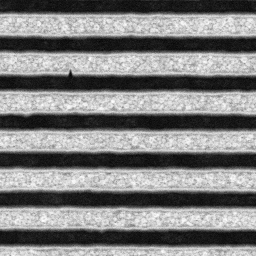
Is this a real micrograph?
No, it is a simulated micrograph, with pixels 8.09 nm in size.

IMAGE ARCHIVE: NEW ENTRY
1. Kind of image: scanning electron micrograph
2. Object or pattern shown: parallel lines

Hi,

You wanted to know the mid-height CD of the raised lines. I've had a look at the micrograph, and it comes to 186 nm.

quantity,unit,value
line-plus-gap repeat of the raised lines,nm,313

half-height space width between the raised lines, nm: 126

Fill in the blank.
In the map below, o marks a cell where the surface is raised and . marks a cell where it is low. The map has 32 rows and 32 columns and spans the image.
................................
................................
oooooooooooooooooooooooooooooooo
oooooooooooooooooooooooooooooooo
.ooooooooooooooo.o.ooooooooooooo
................................
o...............................
oooooooooooooooooooooooooooooooo
oooooooooooooooooooooooooooooooo
................................
................................
oooooooooo.ooooo.oooooooo..ooooo
oooooooooooooooooooooooooooooooo
oooooooooooooooooooooooooooooooo
................................
................................
oooooooooooooooooooooooooooooooo
oooooooooooooooooooooooooooooooo
oooooooooooooooooooooooooooooooo
................................
................................
oooooooooooooooooooooooooooooooo
oooooooooooooooooooooooooooooooo
oooooooooooooooooooooooooooooooo
................................
................................
oooooooooooooooooooooooooooooooo
oooooooooooooooooooooooooooooooo
oooooooooooooooooooooooooooooooo
................................
................................
oooooooooooooooooooooooooooooooo